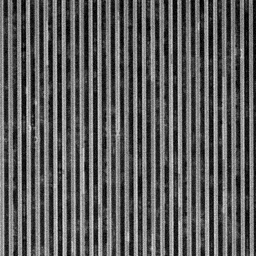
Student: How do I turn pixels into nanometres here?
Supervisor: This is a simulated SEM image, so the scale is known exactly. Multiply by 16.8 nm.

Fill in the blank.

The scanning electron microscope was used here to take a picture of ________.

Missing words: parallel lines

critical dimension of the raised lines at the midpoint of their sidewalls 58.7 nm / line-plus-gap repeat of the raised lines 8.92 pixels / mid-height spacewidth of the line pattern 88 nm